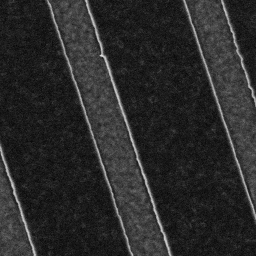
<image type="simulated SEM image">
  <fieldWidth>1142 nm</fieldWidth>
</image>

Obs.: one or a few lines or trenches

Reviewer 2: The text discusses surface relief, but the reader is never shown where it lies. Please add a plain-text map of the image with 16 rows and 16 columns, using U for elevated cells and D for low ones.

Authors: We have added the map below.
UUUDDUUUUUUUDDUU
UUUUDDUUUUUUDDUU
UUUUDDUUUUUUDDDU
UUUUDDUUUUUUUDDU
UUUUUDDUUUUUUDDU
UUUUUDDUUUUUUDDD
UUUUUDDUUUUUUUDD
UUUUUUDDUUUUUUDD
UUUUUUDDUUUUUUDD
UUUUUUDDUUUUUUUD
UUUUUUUDDUUUUUUD
DUUUUUUDDUUUUUUD
DUUUUUUDDUUUUUUU
DUUUUUUDDDUUUUUU
DDUUUUUUDDUUUUUU
DDUUUUUUDDUUUUUU